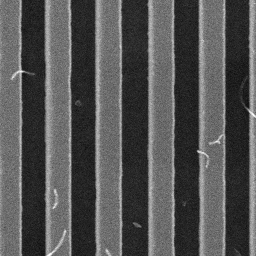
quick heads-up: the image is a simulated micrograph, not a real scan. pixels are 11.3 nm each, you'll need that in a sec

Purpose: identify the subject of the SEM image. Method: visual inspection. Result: lines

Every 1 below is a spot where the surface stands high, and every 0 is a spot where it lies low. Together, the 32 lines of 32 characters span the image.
11100011100011100001110001110001
11100011100011100001110001110001
11100011100011100001110001110001
11100011100011100001110001110001
11100011100011100001110001110001
11100011100011100001110001110001
11100011100011100001110001110001
11100011100011100001110001110001
11100011100011100001110001110001
11100011100011100001110001110001
11100011100011100001110001110001
11100011100011100001110001110001
11100011100011100001110001110001
11100011100011100001110001110001
11100011100011100001110001110001
11100011100011100001110001110001
11100011100011100001110001110001
11100011100011100001110001110001
11100011100011100001110001110001
11100011100011100001110001110001
11100011100011100001110001110001
11100011100011100001110001110001
11100011100011100001110001110001
11100011100011100001110001110001
11100011100011100001110001110001
11100011100011100001110001110001
11100011100011100001110001110001
11100011100011100001110001110001
11100011100011100001110001110001
11100011100011100001110001110001
11100011100011100001110001110001
11100011100011100001110001110001